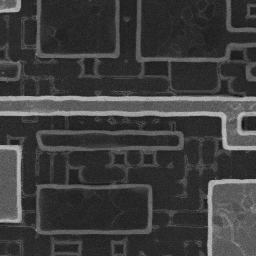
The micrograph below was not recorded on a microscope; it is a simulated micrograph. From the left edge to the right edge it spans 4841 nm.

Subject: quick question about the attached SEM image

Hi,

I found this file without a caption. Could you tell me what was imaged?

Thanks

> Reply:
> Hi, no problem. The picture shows wiring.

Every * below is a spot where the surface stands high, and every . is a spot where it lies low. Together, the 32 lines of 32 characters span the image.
**...**********..************...
.....**********..************...
.....**********..************...
.....**********..************...
.....**********..***************
.....**********..***************
.....**********..************...
................................
**.............................*
**.............................*
................................
................................
********************************
********************************
............................**..
............................**..
............................**..
.....******************.....****
*....*****************.......***
**..............................
**..............................
**..............................
**..............................
**...*************........******
**...**************.......******
**...**************.......******
**...**************.......******
**...**************.......******
.....**************.......******
..........................******
..........................******
..........................******